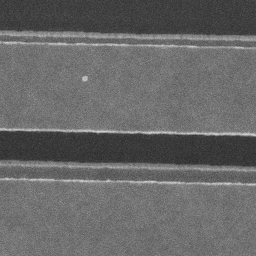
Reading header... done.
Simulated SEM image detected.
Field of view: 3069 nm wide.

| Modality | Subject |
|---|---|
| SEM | lines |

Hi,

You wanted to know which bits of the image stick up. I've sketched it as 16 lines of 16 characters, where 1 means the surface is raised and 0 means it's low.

0000000000000000
0000000000000000
1111111111111111
1111111111111111
1111111111111111
1111111111111111
1111111111111111
1111111111111111
0000000000000000
0000000000000000
1111111111100000
1111111111111111
1111111111111111
1111111111111111
1111111111111111
1111111111111111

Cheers